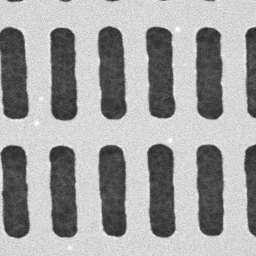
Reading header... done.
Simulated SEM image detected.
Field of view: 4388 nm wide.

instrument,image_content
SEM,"a regular array of holes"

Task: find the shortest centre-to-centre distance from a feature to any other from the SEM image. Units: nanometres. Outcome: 832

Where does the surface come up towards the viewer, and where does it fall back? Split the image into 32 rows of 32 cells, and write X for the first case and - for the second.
XXXXXXXXXXXXXXXXXXXXXXXXXXXXXXXX
XXXXXXXXXXXXXXXXXXXXXXXXXXXXXXXX
XXXXXXXXXXXXXXXXXXXXXXXXXXXXXXXX
X-XXXXX-XXXXX-XXXXX--XXXX--XXXX-
---XXX---XXX---XXX---XXX----XXX-
---XXX---XXX---XXX---XXX----XXX-
---XXX---XXX----XX----XX----XXX-
---XXX----XX----XXX---XX----XXX-
---XXX---XXX----XX----XX----XXX-
---XXX---XXX----XXX---XXX---XXX-
---XXX----XX----XXX---XXX---XXX-
---XXX----XXX---XXX---XXX---XXX-
----XX----XXX---XXX---XXX---XXX-
----XX----XXX---XXX---XXX---XXX-
X--XXXX--XXXX--XXXX--XXXX---XXX-
XXXXXXXXXXXXXXXXXXXXXXXXXXXXXXXX
XXXXXXXXXXXXXXXXXXXXXXXXXXXXXXXX
XXXXXXXXXXXXXXXXXXXXXXXXXXXXXXXX
X--XXXX--XXXX--XXXX--XXXX--XXXX-
---XXX---XXX----XX----XX----XXX-
---XXX---XXX----XX----XXX---XXX-
---XXX---XXX----XXX---XXX---XXX-
---XXX---XXX----XXX---XXX---XXX-
----XX---XXX----XXX---XXX---XXX-
----XX----XXX---XXX---XXX---XXX-
----XX----XXX---XXX---XXX---XXX-
----XX----XXX---XXX---XXX---XXX-
----XX----XXX---XXX---XXX---XXX-
----XXX---XXX---XXX---XXX---XXX-
X--XXXX--XXXXX-XXXX--XXXXXXXXXXX
XXXXXXXXXXXXXXXXXXXXXXXXXXXXXXXX
XXXXXXXXXXXXXXXXXXXXXXXXXXXXXXXX